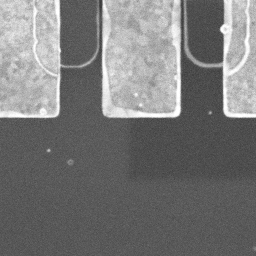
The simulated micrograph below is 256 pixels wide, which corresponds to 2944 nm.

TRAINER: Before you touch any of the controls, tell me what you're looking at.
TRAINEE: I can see wiring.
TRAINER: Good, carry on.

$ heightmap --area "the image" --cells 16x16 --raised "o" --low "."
ooooooooooo.oooo
oooooo.oooo.oooo
ooooooooooo.oooo
ooooooooooo.oooo
oooo...oooo...oo
oooo...oooo...oo
oooo...oooo...oo
................
................
................
................
................
................
................
................
................